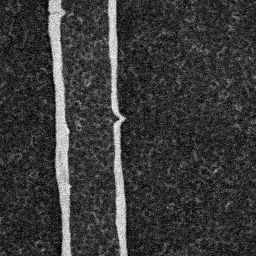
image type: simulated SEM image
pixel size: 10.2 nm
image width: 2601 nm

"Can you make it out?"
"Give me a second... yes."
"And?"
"one or a few lines or trenches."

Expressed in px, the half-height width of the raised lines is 59.1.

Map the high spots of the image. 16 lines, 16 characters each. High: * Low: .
...****.........
...****.........
...****.........
...****.........
...****.........
....***.........
....***.........
....***.........
....***.........
....***.........
....***.........
....***.........
....****........
....****........
....****........
....****........